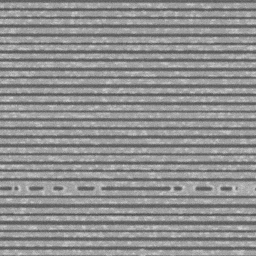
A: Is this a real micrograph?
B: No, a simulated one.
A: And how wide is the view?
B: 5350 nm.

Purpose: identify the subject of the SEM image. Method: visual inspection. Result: parallel lines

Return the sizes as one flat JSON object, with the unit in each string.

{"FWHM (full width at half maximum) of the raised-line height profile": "99.3 nm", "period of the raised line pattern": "8.51 px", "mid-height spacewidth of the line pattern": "78.4 nm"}